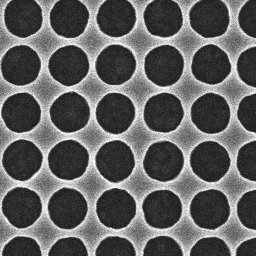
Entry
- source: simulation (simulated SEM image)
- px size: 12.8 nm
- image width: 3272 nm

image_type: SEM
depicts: a regular array of holes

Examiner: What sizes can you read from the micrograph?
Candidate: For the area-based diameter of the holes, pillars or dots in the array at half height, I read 516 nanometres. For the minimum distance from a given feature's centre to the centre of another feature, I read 0.593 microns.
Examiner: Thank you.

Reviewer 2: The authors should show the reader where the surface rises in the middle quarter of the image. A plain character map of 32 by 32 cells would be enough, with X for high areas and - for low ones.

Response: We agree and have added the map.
------XX----------XX----------XX
------XX----------XX----------XX
------XX---------XXX---------XXX
-----XXXX--------XXXX--------XXX
----XXXXXX-----XXXXXXX------XXXX
X-XXXXXXXXXXXXXXXXXXXXX----XXXXX
XXXXXXXXXXXXXXXXXXXXXXXXXXXXXXXX
----XXXXXXX----XXXXXXXXX---XXXXX
-----XXXXX------XXXXX-------XXXX
------XXX--------XXXX--------XXX
------XX----------XX---------XXX
-------X----------XX----------XX
-------X----------XX----------X-
------XX----------XX----------XX
------XX---------XXX---------XXX
------XXX-------XXXXX-------XXXX
----XXXXXX------XXXXXX-----XXXXX
XXXXXXXXXXXX--XXXXXXXXXXXXXXXXXX
XXXXXXXXXXXXXXXXXXXXXXXXXXXXXXXX
----XXXXXXX----XXXXXXXX----XXXXX
-----XXXX-------XXXXXX------XXXX
------XXX--------XXXX--------XXX
------XX---------XXX----------XX
------XX----------XX----------X-
------XX----------XX----------X-
------XX----------XX----------XX
-----XXXX--------XXX---------XXX
-----XXXX--------XXXX--------XXX
---XXXXXXX------XXXXXX------XXXX
XXXXXXXXXXX---XXXXXXXXXX-XXXXXXX
XXXXXXXXXXXXXXXXXXXXXXXXXXXXXXXX
---XXXXXXXX----XXXXXXXX---XXXXXX